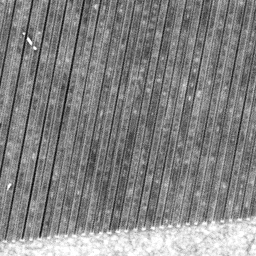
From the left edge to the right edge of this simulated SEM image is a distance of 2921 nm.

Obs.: parallel lines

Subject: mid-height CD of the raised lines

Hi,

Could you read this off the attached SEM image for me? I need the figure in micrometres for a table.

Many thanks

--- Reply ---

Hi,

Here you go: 0.0309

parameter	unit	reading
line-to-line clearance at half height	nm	60.3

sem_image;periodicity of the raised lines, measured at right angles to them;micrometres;0.0959